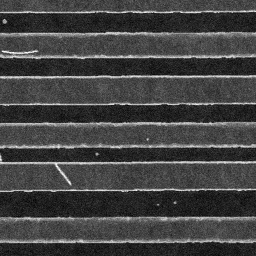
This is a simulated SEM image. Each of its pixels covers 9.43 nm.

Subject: lines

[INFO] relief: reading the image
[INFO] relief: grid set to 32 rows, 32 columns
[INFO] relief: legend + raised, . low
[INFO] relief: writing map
++++++++++++++++++++++++++++++++
++++++++++++++++++++++++++.+.+..
................................
................................
++++++++++++++++++++++++++++++++
++++++++++++++++++++++++++++++++
++++++++++++++++++++++++++++++++
................................
................................
................................
++++++++++++++++++++++++++++++++
++++++++++++++++++++++++++++++++
++++++++++++++++++++++++++++++++
................................
................................
...++++.....++..++++++++++++..++
++++++++++++++++++++++++++++++++
++++++++++++++++++++++++++++++++
................................
................................
++++++++++++++++++++++++++++++++
++++++++++++++++++++++++++++++++
++++++++++++++++++++++++++++++++
++++++++++++++++++++++++++++++++
................................
................................
................................
++++++++++.+++++++++++++++++++++
++++++++++++++++++++++++++++++++
++++++++++++++++++++++++++++++++
................................
................................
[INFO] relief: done